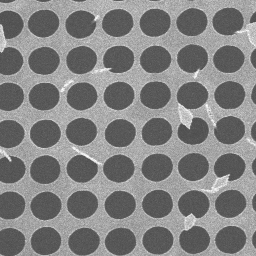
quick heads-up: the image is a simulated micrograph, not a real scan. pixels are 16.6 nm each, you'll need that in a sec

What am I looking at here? a regular array of holes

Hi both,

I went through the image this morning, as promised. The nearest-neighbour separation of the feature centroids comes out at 0.595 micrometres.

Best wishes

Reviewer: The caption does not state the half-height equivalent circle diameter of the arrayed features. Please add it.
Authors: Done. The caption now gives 0.493 micrometres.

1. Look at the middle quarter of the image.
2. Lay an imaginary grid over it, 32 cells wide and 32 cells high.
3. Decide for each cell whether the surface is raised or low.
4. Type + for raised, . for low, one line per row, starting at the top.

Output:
+.......++.......++.......+++...
+......++++.....++++......++++..
+++..+++++++++++++++++++++++++++
++++++++++++++++++++++++++++++++
+++++++++++++..+++++++..+++++++.
++.....++++......+++......+++...
+.......++.......++.......++....
+.......++........+........+....
+.......++........+........+....
+.......++.......++.......+++...
++.....++++.....++++.....+++++..
+++..++++++++.++++++++++++++++++
++++++++++++++++++++++++++++++++
++++.+++++++++++++++++..++++++++
++.....+++++.....++++.....++++++
+.......+++.......++.......++..+
........++........+........+....
........++........+........+....
+.......++........++.......++...
++.....++++......+++......++++..
++++.+++++++....++++++.+++++++++
++++++++++++++++++++++++++++++++
++++++++++++++++++++++..+++++++.
++....+++++.....++++......+++...
+.......++.......+++.......++...
+.......++........+........+....
........++........+........+....
+.......++.......++........++...
++.....++++......+++......++++..
+++...+++++++..++++++++.++++++++
++++++++++++++++++++++++++++++++
+++++++++++++++++++++++.++++++++